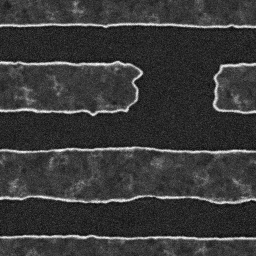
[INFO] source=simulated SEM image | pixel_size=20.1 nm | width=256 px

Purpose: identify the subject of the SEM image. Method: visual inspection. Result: one or a few lines or trenches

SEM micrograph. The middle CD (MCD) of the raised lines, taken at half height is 0.961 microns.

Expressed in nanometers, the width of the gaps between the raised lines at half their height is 770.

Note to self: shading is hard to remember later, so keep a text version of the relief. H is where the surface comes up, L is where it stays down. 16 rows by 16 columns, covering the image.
HHHHHHHHHHHHHHHH
HHHHHHHHHHHHHHHH
LLLLLLLLLLLLLLLL
LLLLLLLLLLLLLLLL
HHHHHHHHHLLLLLHH
HHHHHHHHLLLLLLHH
HHHHHHHHLLLLLLHH
LLLLLLLLLLLLLLLL
LLLLLLLLLLLLLLLL
HHHHHHHHHHHHHHHH
HHHHHHHHHHHHHHHH
HHHHHHHHHHHHHHHH
LLLLHHHHLLLLLHHH
LLLLLLLLLLLLLLLL
LLLLLLLLLLLLLLLL
HHHHHHHHHHHHHHHH